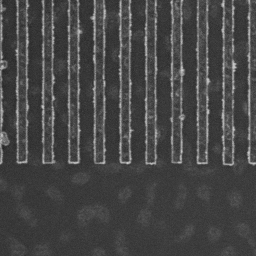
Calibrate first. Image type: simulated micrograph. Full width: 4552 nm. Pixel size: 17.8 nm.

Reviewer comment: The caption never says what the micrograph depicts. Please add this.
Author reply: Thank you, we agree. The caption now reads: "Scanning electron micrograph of parallel lines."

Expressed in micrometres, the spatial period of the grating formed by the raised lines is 0.457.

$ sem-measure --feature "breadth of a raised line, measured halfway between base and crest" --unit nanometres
182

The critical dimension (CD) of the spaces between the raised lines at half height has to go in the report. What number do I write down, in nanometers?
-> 276